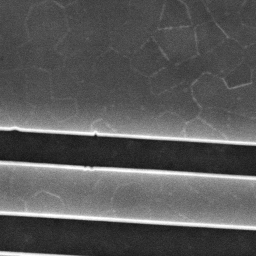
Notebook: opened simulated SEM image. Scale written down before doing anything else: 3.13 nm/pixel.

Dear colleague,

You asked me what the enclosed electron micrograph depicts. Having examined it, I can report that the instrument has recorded one or a few lines or trenches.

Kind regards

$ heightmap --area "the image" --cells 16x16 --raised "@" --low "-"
@@@@@@@@@@@@@@@@
@@@@@@@@@@@@@@@@
@@@@@@@@@@@@@@@@
@@@@@@@@@@@@@@@@
@@@@@@@@@@@@@@@@
@@@@@@@@@@@@@@@@
@@@@@@@@@@@@@@@@
@@@@@@@@@@@@@@@@
-------@@@@@@@@@
----------------
@@@@@@----------
@@@@@@@@@@@@@@@@
@@@@@@@@@@@@@@@@
---@@@@@@@@@@@@@
----------------
----------------